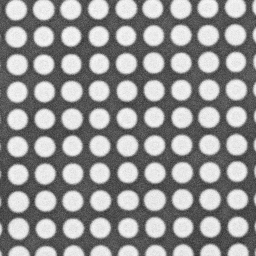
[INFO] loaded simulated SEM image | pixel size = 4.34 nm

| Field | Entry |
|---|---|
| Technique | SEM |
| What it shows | an array of small figures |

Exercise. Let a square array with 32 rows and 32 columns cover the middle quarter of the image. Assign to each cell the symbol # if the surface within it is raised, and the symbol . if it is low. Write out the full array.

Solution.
####..#####..#####..#####..#####
####...####...####...###...####.
................................
................................
.##.....##.....##....###....###.
####...####...####..#####..#####
####..#####..#####..#####..#####
####..#####..#####..#####..#####
####...####...####...###....###.
................................
................................
.##.....##....###....###....###.
####...####..#####..#####..#####
#####.#####..#####..#####..#####
####..#####..#####..#####..#####
####...####...###....###....###.
................................
................................
.###...###....####...###....###.
####...####..#####..#####..#####
#####..####..#####..#####..#####
####...####..#####..#####..#####
.###...####...###....###....###.
................................
................................
.###...####...####...####...####
#####..####...####..#####..#####
#####..####...####..#####..#####
#####..####...####..#####..#####
.###....##.....##.....##....###.
................................
.............................#..